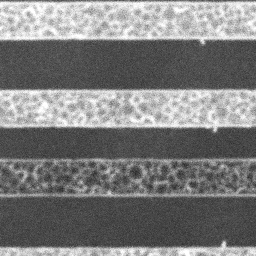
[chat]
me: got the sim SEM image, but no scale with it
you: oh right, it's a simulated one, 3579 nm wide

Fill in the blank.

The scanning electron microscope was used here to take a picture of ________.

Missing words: one or a few lines or trenches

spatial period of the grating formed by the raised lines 1100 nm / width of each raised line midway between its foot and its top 503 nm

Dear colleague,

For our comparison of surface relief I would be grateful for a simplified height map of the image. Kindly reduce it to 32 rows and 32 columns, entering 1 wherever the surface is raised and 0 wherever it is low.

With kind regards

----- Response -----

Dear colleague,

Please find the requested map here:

11111111111111111011111111111111
11111111111111111111111111111111
11111111111111111111111111111111
11111111111111111111111111111111
11111111111111111111111111111111
00000000000000000000000000000000
00000000000000000000000000000000
00000000000000000000000000000000
00000000000000000000000000000000
00000000000000000000000000000000
00000000000000000000000000000000
00111111111111111111111111111111
11111111111111111111111111111111
11111111111111111111111111111111
11111111111111111111111111111111
11111111111111111111111111111111
00000000000000000000000000000000
00000000000000000000000000000000
00000000000000000000000000000000
00000000000000000000000000000000
11111111111111111111111111111111
11111111111111111111111111111111
11111111111111111111111111111111
11111111111111111111111111111111
00000000000000000000000000000000
00000000000000000000000000000000
00000000000000000000000000000000
00000000000000000000000000000000
00000000000000000000000000000000
00000000000000000000000000000000
00000000000000000000000000000000
11111111111111111111111111111111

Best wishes